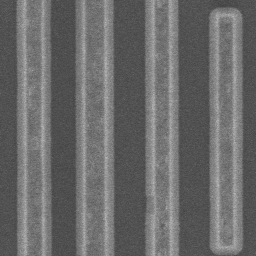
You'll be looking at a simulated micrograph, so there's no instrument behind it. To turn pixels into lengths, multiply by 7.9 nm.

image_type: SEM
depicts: one or a few lines or trenches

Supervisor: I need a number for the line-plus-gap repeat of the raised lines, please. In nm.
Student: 506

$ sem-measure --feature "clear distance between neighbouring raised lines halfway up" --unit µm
0.328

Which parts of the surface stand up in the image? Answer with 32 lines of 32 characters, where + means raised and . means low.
...+++....+++......+++..........
...+++....+++......+++..........
...+++....+++......+++.....+++..
...+++....+++......+++.....+++..
...+++....+++......+++.....+++..
...+++....+++......+++.....+++..
...+++....+++......+++.....+++..
...+++....+++......+++.....+++..
...+++....+++......+++.....+++..
...+++....+++......+++.....+++..
...+++....+++......+++.....+++..
...+++....+++......+++.....+++..
...+++....+++......+++.....+++..
...+++....+++......+++.....+++..
...+++....+++......+++.....+++..
...+++....+++......+++.....+++..
...+++....+++......+++.....+++..
...+++....+++......+++.....+++..
...+++....+++......+++.....+++..
...+++....+++......+++.....+++..
...+++....+++......+++.....+++..
...+++....+++......+++.....+++..
...+++....+++......+++.....+++..
...+++....+++......+++.....+++..
...+++....+++......+++.....+++..
...+++....+++......+++.....+++..
...+++....++++.....+++.....+++..
...+++....++++.....+++.....+++..
...+++....++++.....+++.....+++..
...+++....++++.....+++.....+++..
...+++....++++.....+++.....+++..
...+++....++++.....+++..........